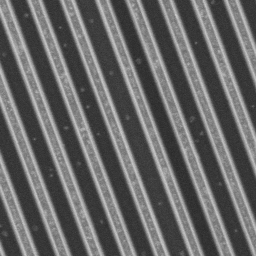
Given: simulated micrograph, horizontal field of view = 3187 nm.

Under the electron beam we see parallel lines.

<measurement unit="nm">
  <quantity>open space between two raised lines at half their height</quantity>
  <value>236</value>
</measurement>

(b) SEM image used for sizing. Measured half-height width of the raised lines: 142 nm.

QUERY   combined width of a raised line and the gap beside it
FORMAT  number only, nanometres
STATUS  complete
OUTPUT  383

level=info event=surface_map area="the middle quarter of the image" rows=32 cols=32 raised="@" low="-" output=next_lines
-----@@@------@@@-----@@@-----@@
@-----@@@------@@@----@@@-----@@
@-----@@@------@@@-----@@@-----@
@-----@@@-------@@-----@@@-----@
@@-----@@@------@@@----@@@-----@
@@-----@@@------@@@-----@@@-----
@@------@@@------@@-----@@@-----
@@@-----@@@------@@@----@@@-----
@@@-----@@@------@@@-----@@@----
-@@@-----@@@------@@@----@@@----
-@@@-----@@@------@@@----@@@----
-@@@-----@@@-------@@-----@@@---
--@@@-----@@@------@@@----@@@---
--@@@-----@@@------@@@-----@@@--
--@@@------@@@------@@-----@@@--
---@@@-----@@@------@@@----@@@--
---@@@-----@@@------@@@-----@@@-
----@@@-----@@@------@@-----@@@-
----@@@-----@@@------@@@----@@@-
----@@@-----@@@------@@@-----@@@
-----@@@-----@@@------@@@----@@@
-----@@@-----@@@------@@@-----@@
-----@@@-----@@@-------@@-----@@
@-----@@@-----@@@------@@@----@@
@-----@@@-----@@@------@@@-----@
@------@@@-----@@@------@@-----@
@@-----@@@-----@@@------@@@----@
@@-----@@@-----@@@------@@@-----
@@------@@@-----@@@------@@@----
@@@-----@@@-----@@@------@@@----
@@@-----@@@-----@@@-------@@----
@@@------@@@-----@@@------@@@---